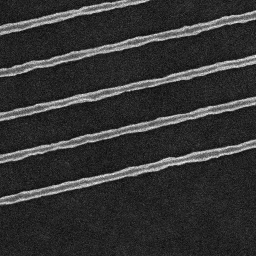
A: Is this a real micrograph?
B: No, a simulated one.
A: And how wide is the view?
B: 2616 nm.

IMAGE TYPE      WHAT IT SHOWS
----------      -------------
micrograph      parallel lines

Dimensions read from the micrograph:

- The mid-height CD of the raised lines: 64.8 nanometres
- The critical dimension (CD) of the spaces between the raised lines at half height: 364 nanometers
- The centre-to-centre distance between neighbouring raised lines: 427 nanometres